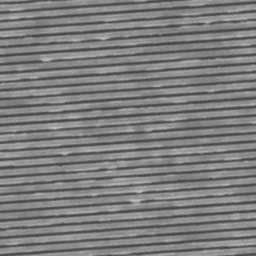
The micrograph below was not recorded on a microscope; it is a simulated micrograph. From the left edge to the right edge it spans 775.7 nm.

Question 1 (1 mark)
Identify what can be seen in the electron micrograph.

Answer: parallel lines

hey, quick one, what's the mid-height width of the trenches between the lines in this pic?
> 0.0109 um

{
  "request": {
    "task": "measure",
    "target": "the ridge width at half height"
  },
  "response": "16.6 nm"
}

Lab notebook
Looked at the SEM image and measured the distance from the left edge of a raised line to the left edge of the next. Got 26.2 nm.